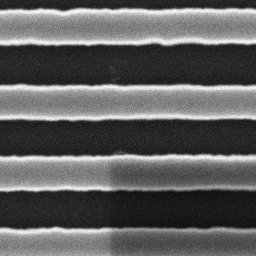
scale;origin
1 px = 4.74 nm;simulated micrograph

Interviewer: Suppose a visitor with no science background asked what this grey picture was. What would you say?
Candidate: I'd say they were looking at lines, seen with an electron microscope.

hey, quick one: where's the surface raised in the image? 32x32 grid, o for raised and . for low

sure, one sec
................................
oooooooooooooooooooooooooooooooo
oooooooooooooooooooooooooooooooo
oooooooooooooooooooooooooooooooo
oooooooooooooooooooooooooooooooo
.....ooo..oo.....o..............
................................
................................
................................
................................
................................
oooooooooooooooooooooooooooooooo
oooooooooooooooooooooooooooooooo
oooooooooooooooooooooooooooooooo
oooooooooooooooooooooooooooooooo
................................
................................
................................
................................
..............oooo..ooooooo.....
oooooooooooooooooooooooooooooooo
oooooooooooooooooooooooooooooooo
oooooooooooooooooooooooooooooooo
ooooooooooooooooooooooooooo.oooo
................................
................................
................................
................................
................................
oooooooooooooooooooooooooooooooo
oooooooooooooooooooooooooooooooo
oooooooooooooooooooooooooooooooo